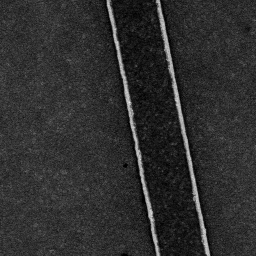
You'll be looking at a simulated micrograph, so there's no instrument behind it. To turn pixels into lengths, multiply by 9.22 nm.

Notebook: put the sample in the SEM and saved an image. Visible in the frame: one or a few lines or trenches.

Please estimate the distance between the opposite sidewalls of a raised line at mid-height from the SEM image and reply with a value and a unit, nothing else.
453 nanometres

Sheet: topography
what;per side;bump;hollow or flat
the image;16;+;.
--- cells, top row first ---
.......+++......
.......+++......
.......+++......
.......++++.....
........+++.....
........+++.....
........+++.....
........+++.....
........++++....
.........+++....
.........+++....
.........+++....
.........+++....
.........++++...
..........+++...
..........+++...